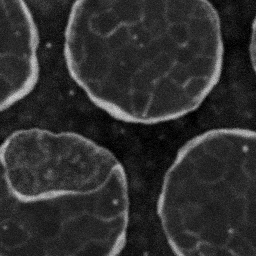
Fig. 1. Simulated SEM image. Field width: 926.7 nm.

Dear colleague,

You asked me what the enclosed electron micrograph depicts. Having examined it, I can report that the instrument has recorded raised bodies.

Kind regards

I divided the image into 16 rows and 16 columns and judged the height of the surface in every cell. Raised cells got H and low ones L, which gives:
HHLLLHHHHHHHHLLL
HHLLHHHHHHHHHHLL
HHLLHHHHHHHHHHLL
HHLLHHHHHHHHHHLL
HHLLHHHHHHHHHHLL
HHLLLHHHHHHHHLLL
LLLLLLHHHHHHLLLL
LLLLLLLLHHLLLLLL
LLLLLLLLLLLLLHHH
LLLLLLLLLLLLHHHH
LLLLLLLLLLLHHHHH
HLLLLLHHLLHHHHHH
HHHHHHHHLLHHHHHH
HHHHHHHHLLHHHHHH
HHHHHHHHLLHHHHHH
HHHHHHHLLLLHHHHH